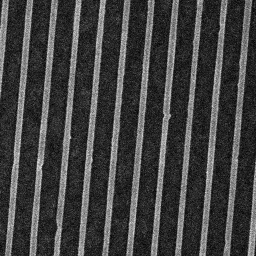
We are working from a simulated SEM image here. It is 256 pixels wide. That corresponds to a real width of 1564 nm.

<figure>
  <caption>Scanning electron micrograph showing parallel lines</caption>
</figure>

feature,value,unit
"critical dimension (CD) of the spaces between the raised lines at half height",113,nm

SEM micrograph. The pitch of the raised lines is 148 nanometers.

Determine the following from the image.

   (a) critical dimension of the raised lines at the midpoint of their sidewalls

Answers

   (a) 35.8 nanometers